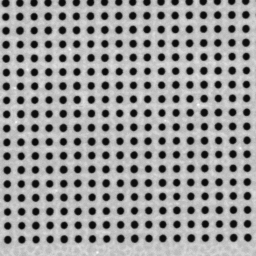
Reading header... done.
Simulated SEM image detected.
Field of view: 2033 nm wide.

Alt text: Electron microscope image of a regular array of holes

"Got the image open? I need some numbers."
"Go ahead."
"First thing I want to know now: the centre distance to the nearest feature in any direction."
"0.109 micrometres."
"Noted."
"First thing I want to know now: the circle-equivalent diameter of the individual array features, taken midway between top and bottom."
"7.41 px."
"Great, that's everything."